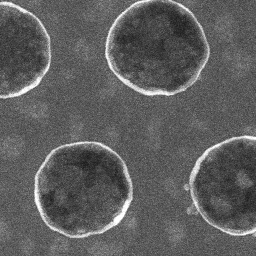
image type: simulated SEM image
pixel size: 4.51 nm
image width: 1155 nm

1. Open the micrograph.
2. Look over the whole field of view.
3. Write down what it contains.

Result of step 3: raised bodies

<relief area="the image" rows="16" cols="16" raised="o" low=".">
o.......oooo....
ooo....ooooo....
ooo....oooooo...
ooo....oooooo...
ooo....oooooo...
oo......oooo....
................
................
................
...oooo......ooo
...ooooo....oooo
..oooooo....oooo
..oooooo....oooo
...ooooo.....ooo
....oo........oo
................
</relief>